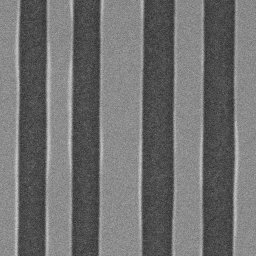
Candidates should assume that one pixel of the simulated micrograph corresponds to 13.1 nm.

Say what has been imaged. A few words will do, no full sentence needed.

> groups of lines, slits or small figures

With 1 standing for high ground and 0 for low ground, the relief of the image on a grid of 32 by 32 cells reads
11000011100001111100001110000011
11000011100001111100001110000011
11000011100001111100001110000011
11000011100001111100001110000011
11000011100001111100001110000011
11000011100001111100001110000011
11000011100001111100001110000111
11000011100001111100001110000111
11000011100001111100001110000111
11000011100001111100001110000111
11000011100001111100001110000111
11000011100001111100001110000111
11000011100001111100001110000111
11000011100001111100001110000111
11000011100001111100001110000111
11000011100001111100001110000011
11000011100001111100001110000011
11000011100001111100001110000011
11000011100001111100001110000011
11000011100001111100001110000011
11000011100001111100001110000011
11000011100001111100001110000011
11000011100001111100001110000011
11000011100001111100001110000111
11000011100001111100001110000111
11000011100001111100001110000111
11000011100001111100001110000111
11000011100001111100001110000111
11000011100001111100001110000111
11000011100001111100001110000111
11000011100001111100001110000111
11000011100011111100001110000111